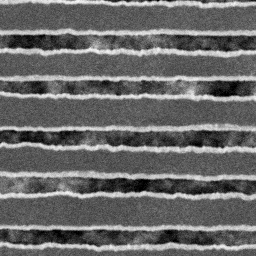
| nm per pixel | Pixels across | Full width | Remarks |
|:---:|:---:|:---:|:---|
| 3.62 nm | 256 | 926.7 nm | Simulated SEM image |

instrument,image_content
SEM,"lines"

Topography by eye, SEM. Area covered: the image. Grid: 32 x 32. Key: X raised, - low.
XXXXXXXXXXXXXX-XXXXXX-XXX----X--
XXXXXXXXXXXXXXXXXXXXXXXXXXXXXXXX
XXXXXXXXXXXXXXXXXXXXXXXXXXXXXXXX
XXXXXXXXXXXXXXXXXXXXXXXXXXXXXXXX
--------------------------------
--------------------------------
XXXXX--XXXXXXXXX---XXX----------
XXXXXXXXXXXXXXXXXXXXXXXXXXXXXXXX
XXXXXXXXXXXXXXXXXXXXXXXXXXXXXXXX
XXXXXXXXXXXXXXXXXXXXXXXXXXXXXXXX
--------------------------------
--------------------------------
XXXXXXXXXXXXXXXXXXXXXXXXXXXXXXXX
XXXXXXXXXXXXXXXXXXXXXXXXXXXXXXXX
XXXXXXXXXXXXXXXXXXXXXXXXXXXXXXXX
XXXXXXXXXXXXXXXXXXXXXXXXXXXXXXXX
--------------------------------
--------------------------------
XXXXXXXX-XX-XX------------------
XXXXXXXXXXXXXXXXXXXXXXXXXXXXXXXX
XXXXXXXXXXXXXXXXXXXXXXXXXXXXXXXX
XXXXXXXXXXXXXXXXXXXXXXXXXXXXXXXX
--------------------------------
--------------------------------
-XX-XXXXXX-XXXXXXXXXXXX----XXX--
XXXXXXXXXXXXXXXXXXXXXXXXXXXXXXXX
XXXXXXXXXXXXXXXXXXXXXXXXXXXXXXXX
XXXXXXXXXXXXXXXXXXXXXXXXXXXXXXXX
----------------X-XX----XXX----X
--------------------------------
--------------------------------
XXXXXXXXXXXXXXXXXXXXXXXXXXXXXXXX